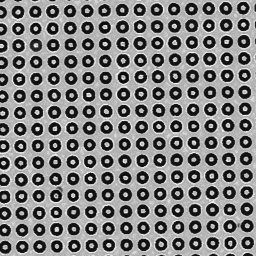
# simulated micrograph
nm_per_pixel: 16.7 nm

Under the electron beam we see a regular array of ring-shaped grooves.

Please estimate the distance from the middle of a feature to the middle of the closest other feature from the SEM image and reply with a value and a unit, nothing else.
0.277 µm